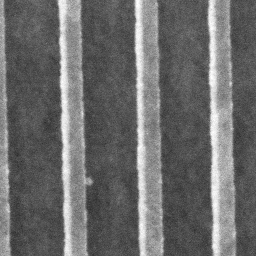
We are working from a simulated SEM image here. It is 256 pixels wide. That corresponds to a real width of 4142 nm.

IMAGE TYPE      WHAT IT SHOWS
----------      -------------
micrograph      lines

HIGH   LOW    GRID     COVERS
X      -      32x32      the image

--------XX-------XXX------XXX---
--------XX-------XXX------XXX---
--------XX-------XXX------XXX---
--------XX-------XXX------XXX---
--------XX-------XXX------XXX---
--------XX-------XXX------XXX---
X-------XX-------XXX------XXX---
X-------XX-------XXX------XXX---
X-------XX-------XXX------XXX---
X-------XX-------XXX-------XX---
X-------XX-------XXX-------XX---
X-------XX-------XXX-------XX---
X-------XX-------XXX-------XX---
X-------XX-------XXX-------XX---
X-------XX-------XXX-------XX---
X-------XX-------XXX-------XX---
X-------XX-------XXX-------XX---
X-------XX-------XXX-------XX---
X-------XX-------XXX-------XX---
X-------XX--------XX-------XX---
X-------XX--------XX-------XX---
X-------XXX-------XX-------XX---
X-------XXX-------XX-------XX---
X-------XXX-------XX-------XX---
X-------XXX-------XX-------XX---
X-------XXX-------XX-------XX---
X-------XXX-------XX-------XX---
X-------XXX-------XX-------XX---
X-------XXX-------XX-------XX---
X-------XXX-------XX-------XX---
X-------XXX-------XX-------XX---
X-------XXX-------XX-------XX---